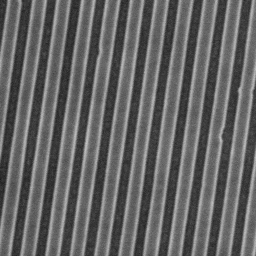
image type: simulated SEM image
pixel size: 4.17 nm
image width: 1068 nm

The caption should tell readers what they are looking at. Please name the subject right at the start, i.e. parallel lines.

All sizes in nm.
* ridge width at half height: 57.3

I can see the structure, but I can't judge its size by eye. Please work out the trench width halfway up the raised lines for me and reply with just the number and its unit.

42.8 nm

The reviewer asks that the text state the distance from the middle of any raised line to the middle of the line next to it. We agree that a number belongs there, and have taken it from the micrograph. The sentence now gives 101 nanometres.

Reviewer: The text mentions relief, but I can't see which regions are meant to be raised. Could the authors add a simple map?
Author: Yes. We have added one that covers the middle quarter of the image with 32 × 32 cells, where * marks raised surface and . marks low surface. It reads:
..***...****..****..****..****..
..***...***...***...****..****..
..***...***...***...***...****..
..***...***...***...***...****..
..***...***...***...***...***...
.****...***...***...***...***...
.****..****..****...***...***...
.****..****..****..****..****...
.***...***...****..****..****..*
.***...***...***...***...****..*
.***...***...***...***...****..*
.***...***...***...***...***...*
****...***...***...***...***...*
****..****..****...***...***...*
****..****..****..****..****...*
***...***...****..****..****..**
***...***...***...***...****..**
***...***...***...***...****..**
***...***...***...***...***...**
***...***...***...***...***...**
***..****..****...***...***...**
***..****..****..****...***...**
**...***...****..****..****...**
**...***...***...***...****...**
**...***...***...***...***...***
**...***...***...***...***...***
**...***...***...***...***...***
**..****...***...***...***...***
**..****..****...***...***...***
*...***...****...***...***...***
*...***...***...***...****...***
*...***...***...***...***...****